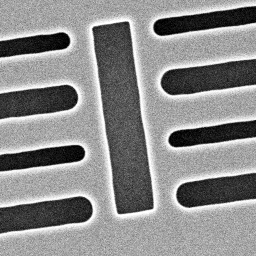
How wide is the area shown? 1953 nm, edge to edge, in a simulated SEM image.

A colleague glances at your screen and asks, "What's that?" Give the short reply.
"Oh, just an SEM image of groups of lines, slits or small figures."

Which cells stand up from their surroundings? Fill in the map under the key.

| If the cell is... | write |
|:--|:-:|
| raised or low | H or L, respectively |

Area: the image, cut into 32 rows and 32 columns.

HHHHHHHHHHHHHHHHHHHHHHHHHHHHHHHH
HHHHHHHHHHHHHHHHHHHHHHHHHHLLLLLL
HHHHHHHHHHHHHHHHHHHHLLLLLLLLLLLL
HHHHHHHHHHHHLLLLHHHLLLLLLLLHHHHH
HHHHLLLLLHHHLLLLHHHHLHHHHHHHHHHH
LLLLLLLLLHHHLLLLLHHHHHHHHHHHHHHH
LLLLLLHHHHHHLLLLLHHHHHHHHHHHHHHH
HHHHHHHHHHHHLLLLLHHHHHHHHHHHHHHL
HHHHHHHHHHHHLLLLLHHHHHHLLLLLLLLL
HHHHHHHHHHHHLLLLLHHHLLLLLLLLLLLL
HHHHHHHHHHHHLLLLLHHHLLLLLLLLLLLL
HLLLLLLLLLHHLLLLLHHHHLLLLHHHHHHH
LLLLLLLLLLHHHLLLLLHHHHHHHHHHHHHH
LLLLLLLLLHHHHLLLLLHHHHHHHHHHHHHH
LLLHHHHHHHHHHLLLLLHHHHHHHHHHHHHH
HHHHHHHHHHHHHLLLLLHHHHHHHHHHLLLL
HHHHHHHHHHHHHLLLLLHHHHLLLLLLLLLL
HHHHHHHHHHHHHLLLLLHHHLLLLLLLLHHH
HHHHHHLLLLHHHHLLLLHHHHHHHHHHHHHH
LLLLLLLLLLLHHHLLLLHHHHHHHHHHHHHH
LLLLLLLLHHHHHHLLLLLHHHHHHHHHHHHH
HHHHHHHHHHHHHHLLLLLHHHHHHHHHHHHH
HHHHHHHHHHHHHHLLLLLHHHHHHLLLLLLL
HHHHHHHHHHHHHHLLLLLHHHLLLLLLLLLL
HHHHHHHHHHHHHHLLLLLHHHLLLLLLLLLL
HHHLLLLLLLLHHHLLLLLHHHLLLLLHHHHH
LLLLLLLLLLLLHHHLLLHHHHHHHHHHHHHH
LLLLLLLLLLLHHHHHHHHHHHHHHHHHHHHH
LLLLLLHHHHHHHHHHHHHHHHHHHHHHHHHH
HHHHHHHHHHHHHHHHHHHHHHHHHHHHHHHH
HHHHHHHHHHHHHHHHHHHHHHHHHHHHHHHH
HHHHHHHHHHHHHHHHHHHHHHHHHHHHHHHH